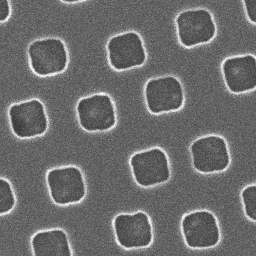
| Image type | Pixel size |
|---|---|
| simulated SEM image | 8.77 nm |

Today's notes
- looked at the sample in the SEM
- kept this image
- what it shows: a regular array of holes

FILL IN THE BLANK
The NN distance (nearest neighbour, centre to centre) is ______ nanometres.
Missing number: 575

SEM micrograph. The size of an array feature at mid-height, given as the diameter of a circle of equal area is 330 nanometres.